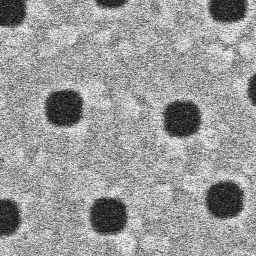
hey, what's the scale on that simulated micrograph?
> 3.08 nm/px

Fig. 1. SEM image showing holes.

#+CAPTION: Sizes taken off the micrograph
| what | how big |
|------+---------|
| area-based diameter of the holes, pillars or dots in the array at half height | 123 nanometres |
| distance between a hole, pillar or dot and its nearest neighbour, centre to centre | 321 nm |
